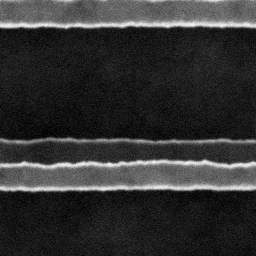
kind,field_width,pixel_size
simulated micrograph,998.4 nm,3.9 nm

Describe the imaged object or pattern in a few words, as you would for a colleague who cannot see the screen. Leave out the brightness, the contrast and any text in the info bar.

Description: lines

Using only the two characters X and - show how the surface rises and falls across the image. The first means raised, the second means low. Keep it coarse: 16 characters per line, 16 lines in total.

XXXXXXXXXXXXXXXX
XXXXXXXXXXXXXXXX
----------------
----------------
----------------
----------------
----------------
----------------
----------------
XXXXXXXXXXXXXXXX
XXXXXXXXXXXXXXXX
XXXXXXXXXXXXXXXX
----------------
----------------
----------------
----------------